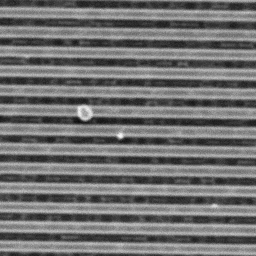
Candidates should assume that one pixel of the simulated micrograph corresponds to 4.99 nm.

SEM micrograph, parallel lines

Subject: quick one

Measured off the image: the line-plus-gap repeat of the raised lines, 0.0972 micrometres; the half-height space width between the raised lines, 0.0486 microns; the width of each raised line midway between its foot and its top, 49.3 nm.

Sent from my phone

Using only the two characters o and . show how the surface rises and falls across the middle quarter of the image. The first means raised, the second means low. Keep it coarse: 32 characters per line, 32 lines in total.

................................
oooooooooooooooooooooooooooooooo
oooooooooooooooooooooooooooooooo
..........................oooooo
................................
................................
oooooooooooooooooooooooooooooooo
oooooooooooooooooooooooooooooooo
...............................o
................................
o...o...........................
oooooooooooooooooooooooooooooooo
oooooooooooooooooooooooooooooooo
....ooo.........................
................................
oooooooooooooooo...ooo..........
oooooooooooooooooooooooooooooooo
oooooooooooooooooooooooooooooooo
................................
................................
oooooooooooooooooooooooo.oo.....
oooooooooooooooooooooooooooooooo
oooooooooooooooooooooooooooooooo
................................
................................
oooooooooooooooooooooooooooooooo
oooooooooooooooooooooooooooooooo
..oooooooooooooooooooooooooooooo
................................
................................
oooooooooooooooooooooooooooooooo
oooooooooooooooooooooooooooooooo